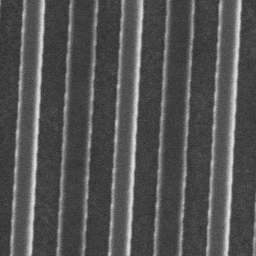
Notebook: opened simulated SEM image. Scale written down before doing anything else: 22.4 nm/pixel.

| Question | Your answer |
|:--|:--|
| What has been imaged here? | lines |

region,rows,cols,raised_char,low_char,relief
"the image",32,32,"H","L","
LLLHHLLLLHHHLLLHHHLLLHHHLLLHHHLL
LLLHHLLLLHHHLLLHHHLLLHHHLLLHHHLL
LLLHHLLLLHHHLLLHHHLLLHHHLLLHHHLL
LLLHHLLLLHHHLLLHHHLLLHHHLLLHHHLL
LLLHHLLLLHHHLLLHHHLLLHHHLLLHHHLL
LLLHHLLLLHHHLLLHHLLLLHHHLLLHHHLL
LLLHHLLLHHHHLLLHHLLLLHHHLLLHHHLL
LLLHHLLLHHHHLLLHHLLLLHHHLLLHHHLL
LLLHHLLLHHHHLLLHHLLLHHHHLLLHHHLL
LLLHHLLLHHHHLLLHHLLLHHHHLLLHHLLL
LLHHHLLLHHHHLLLHHLLLHHHHLLLHHLLL
LLHHHLLLHHHHLLLHHLLLHHHHLLLHHLLL
LLHHHLLLHHHHLLLHHLLLHHHHLLLHHLLL
LLHHHLLLHHHLLLLHHLLLHHHHLLLHHLLL
LLHHHLLLHHHLLLLHHLLLHHHHLLLHHLLL
LLHHHLLLHHHLLLLHHLLLHHHLLLLHHLLL
LLHHHLLLHHHLLLLHHLLLHHHLLLLHHLLL
LLHHHLLLHHHLLLHHHLLLHHHLLLLHHLLL
LLHHLLLLHHHLLLHHHLLLHHHLLLLHHLLL
LLHHLLLLHHHLLLHHHLLLHHHLLLLHHLLL
LLHHLLLLHHHLLLHHHLLLHHHLLLHHHLLL
LLHHLLLLHHHLLLHHHLLLHHHLLLHHHLLL
LLHHLLLLHHHLLLHHHLLLHHHLLLHHHLLL
LLHHLLLLHHHLLLHHHLLLHHHLLLHHHLLL
LLHHLLLLHHHLLLHHLLLLHHHLLLHHHLLL
LLHHLLLLHHHLLLHHLLLLHHHLLLHHHLLL
LLHHLLLHHHHLLLHHLLLLHHHLLLHHHLLL
LLHHLLLHHHHLLLHHLLLHHHHLLLHHHLLL
LLHHLLLHHHHLLLHHLLLHHHHLLLHHLLLL
LHHHLLLHHHHLLLHHLLLHHHHLLLHHLLLL
LHHHLLLHHHHLLLHHLLLHHHHLLLHHLLLL
LHHHLLLHHHHLLLHHLLLHHHHLLLHHLLLL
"